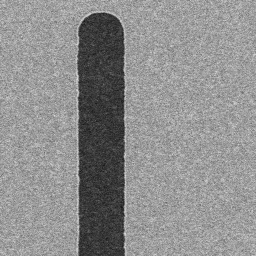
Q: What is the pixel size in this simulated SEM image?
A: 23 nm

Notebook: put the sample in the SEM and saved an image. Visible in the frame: one or a few lines or trenches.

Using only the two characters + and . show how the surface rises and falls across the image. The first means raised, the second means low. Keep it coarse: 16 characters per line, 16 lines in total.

++++++++++++++++
+++++...++++++++
+++++...++++++++
+++++...++++++++
+++++...++++++++
+++++...++++++++
+++++...++++++++
+++++...++++++++
+++++...++++++++
+++++...++++++++
+++++...++++++++
+++++...++++++++
+++++...++++++++
+++++...++++++++
+++++...++++++++
+++++...++++++++